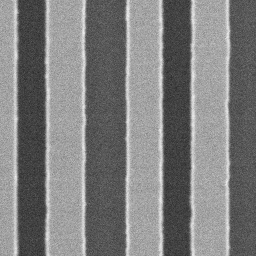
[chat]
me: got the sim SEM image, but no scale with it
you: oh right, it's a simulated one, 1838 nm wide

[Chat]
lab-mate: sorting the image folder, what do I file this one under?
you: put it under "lines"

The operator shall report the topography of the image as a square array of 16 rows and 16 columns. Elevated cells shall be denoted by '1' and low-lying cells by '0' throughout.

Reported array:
1001100011001100
1001100011001100
1001100011001100
1001100011001100
1001100011001100
1001100011001100
1001100011001100
1001100011001100
1001100011001100
1001100011001100
1001100011001100
1001100011001100
1001100011001100
1001100011001100
1001100011001100
1001100011001100